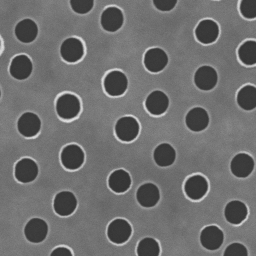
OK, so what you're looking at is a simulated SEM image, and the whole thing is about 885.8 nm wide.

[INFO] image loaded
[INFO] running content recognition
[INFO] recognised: a regular array of holes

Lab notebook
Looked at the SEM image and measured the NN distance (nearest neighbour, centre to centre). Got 148 nm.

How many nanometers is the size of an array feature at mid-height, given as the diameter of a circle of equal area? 82.9